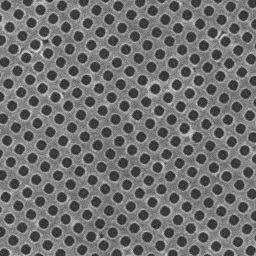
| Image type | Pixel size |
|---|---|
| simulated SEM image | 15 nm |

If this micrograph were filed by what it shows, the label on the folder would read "a regular array of holes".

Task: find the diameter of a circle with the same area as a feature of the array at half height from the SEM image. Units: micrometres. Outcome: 0.166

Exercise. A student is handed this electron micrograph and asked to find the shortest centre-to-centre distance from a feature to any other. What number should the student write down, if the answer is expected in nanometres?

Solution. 231